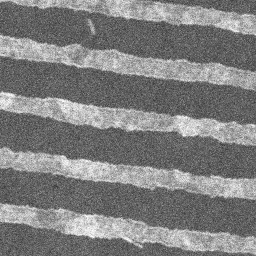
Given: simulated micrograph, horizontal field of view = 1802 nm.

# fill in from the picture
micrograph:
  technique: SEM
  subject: parallel lines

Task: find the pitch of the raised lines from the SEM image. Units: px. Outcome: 55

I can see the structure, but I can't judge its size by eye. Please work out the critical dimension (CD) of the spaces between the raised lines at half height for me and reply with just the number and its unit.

263 nm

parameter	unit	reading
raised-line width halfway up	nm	121